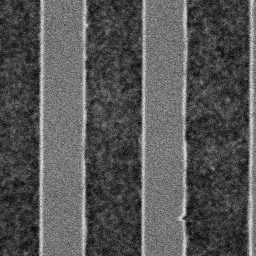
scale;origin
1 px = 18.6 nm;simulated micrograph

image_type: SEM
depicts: one or a few lines or trenches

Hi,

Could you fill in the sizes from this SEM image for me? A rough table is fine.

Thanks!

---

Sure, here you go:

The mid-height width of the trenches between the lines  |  1160 nm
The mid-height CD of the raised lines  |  778 nm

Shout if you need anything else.